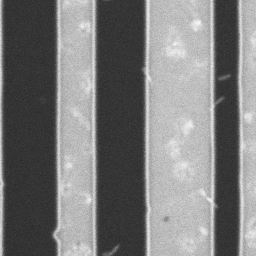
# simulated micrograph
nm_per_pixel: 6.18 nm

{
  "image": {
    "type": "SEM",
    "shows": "one or a few lines or trenches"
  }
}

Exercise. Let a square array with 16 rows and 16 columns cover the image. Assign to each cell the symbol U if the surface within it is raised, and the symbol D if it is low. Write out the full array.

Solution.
UUUUDDUUUDDDDUUD
UUUUDDUUUDDDDUUD
UUUUDDUUUDDDDUUD
UUUUDDUUUDDDDUUD
UUUUDDUUUDDDDUUD
UUUUDDUUUDDDDUUD
UUUUDDUUUDDDDUUD
UUUUDDUUUDDDDUUD
UUUUDDUUUDDDDUUD
UUUUDDUUUDDDDUUD
UUUUDDUUUDDDDUUD
UUUUDDUUUDDDDUUD
UUUUDDUUUDDDDUUD
UUUUDDUUUDDDDUUD
UUUUDDUUUDDDDUUD
UUUUDDUUUDDDDUUD